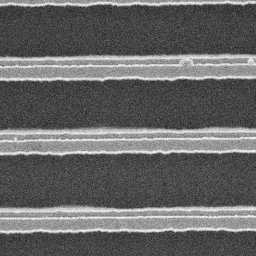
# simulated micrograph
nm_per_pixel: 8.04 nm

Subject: lines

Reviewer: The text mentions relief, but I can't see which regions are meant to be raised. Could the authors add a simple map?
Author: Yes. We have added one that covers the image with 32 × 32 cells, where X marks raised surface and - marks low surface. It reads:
XXXXXXXXXXXX--XXX-XXX-----------
--------------------------------
--------------------------------
--------------------------------
--------------------------------
--------------------------------
--------------------------------
XXXXXXXXXXXXXXXXXXXXXXXXXXXXXXXX
XXXXXXXXXXXXXXXXXXXXXXXXXXXXXXXX
XXXXXXXXXXXXXXXXXXXXXXXXXXXXXXXX
--------------------------------
--------------------------------
--------------------------------
--------------------------------
--------------------------------
--------------------------------
-----------------XXXXXXXXXXXXXXX
XXXXXXXXXXXXXXXXXXXXXXXXXXXXXXXX
XXXXXXXXXXXXXXXXXXXXXXXXXXXXXXXX
--------------------------------
--------------------------------
--------------------------------
--------------------------------
--------------------------------
--------------------------------
--------------------------------
XXXXXXXXXXXXXXXXXXXXXXXXXXXXXXXX
XXXXXXXXXXXXXXXXXXXXXXXXXXXXXXXX
XXXXXXXXXXXXXXXXXXXXXXXXXXXXXXXX
--------------------------------
--------------------------------
--------------------------------